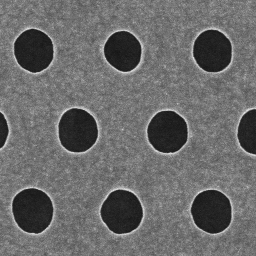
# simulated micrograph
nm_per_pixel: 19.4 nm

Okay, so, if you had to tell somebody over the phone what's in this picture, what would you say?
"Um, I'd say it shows a regular array of holes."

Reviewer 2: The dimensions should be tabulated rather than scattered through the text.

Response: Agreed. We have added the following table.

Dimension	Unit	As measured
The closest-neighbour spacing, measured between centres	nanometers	1730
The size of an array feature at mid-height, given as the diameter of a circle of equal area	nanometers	812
